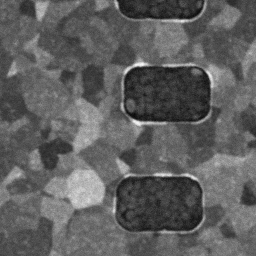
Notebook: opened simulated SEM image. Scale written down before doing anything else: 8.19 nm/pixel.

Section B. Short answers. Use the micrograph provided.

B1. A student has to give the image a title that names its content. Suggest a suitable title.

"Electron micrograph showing holes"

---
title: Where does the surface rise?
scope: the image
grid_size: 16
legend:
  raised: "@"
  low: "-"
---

@@@@@@@------@@@
@@@@@@@@@@@@@@@@
@@@@@@@@@@@@@@@@
@@@@@@@@@@@@@@@@
@@@@@@@@-----@@@
@@@@@@@@-----@@@
@@@@@@@@-----@@@
@@@@@@@@@----@@@
@@@@@@@@@@@@@@@@
@@@@@@@@@@@@@@@@
@@@@@@@@@@@@@@@@
@@@@@@@-----@@@@
@@@@@@@------@@@
@@@@@@@------@@@
@@@@@@@@@@@@@@@@
@@@@@@@@@@@@@@@@